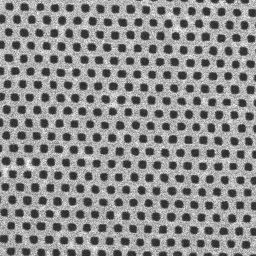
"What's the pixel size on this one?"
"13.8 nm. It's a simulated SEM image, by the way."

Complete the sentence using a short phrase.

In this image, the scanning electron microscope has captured a regular array of holes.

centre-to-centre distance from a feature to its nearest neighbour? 201 nm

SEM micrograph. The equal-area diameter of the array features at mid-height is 125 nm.